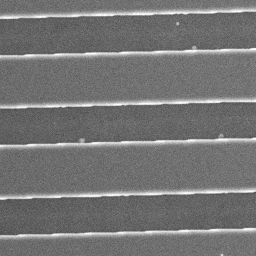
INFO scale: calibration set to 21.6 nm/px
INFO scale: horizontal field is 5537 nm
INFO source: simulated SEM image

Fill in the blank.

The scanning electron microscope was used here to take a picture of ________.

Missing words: lines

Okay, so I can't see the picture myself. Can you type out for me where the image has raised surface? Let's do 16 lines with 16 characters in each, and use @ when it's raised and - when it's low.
@@@@@@@@@@@@@@@@
----------------
----------------
-@@@@@@@@@@@@@@@
@@@@@@@@@@@@@@@@
@@@@@@@@@@@@@@@@
@@@@@@@@--------
----------------
----------------
@@@@@@@@@@@@@@@@
@@@@@@@@@@@@@@@@
@@@@@@@@@@@@@@@@
----------------
----------------
---------@@@@@@@
@@@@@@@@@@@@@@@@